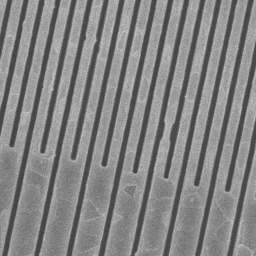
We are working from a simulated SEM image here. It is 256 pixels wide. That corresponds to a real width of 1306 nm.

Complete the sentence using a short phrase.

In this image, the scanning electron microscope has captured parallel lines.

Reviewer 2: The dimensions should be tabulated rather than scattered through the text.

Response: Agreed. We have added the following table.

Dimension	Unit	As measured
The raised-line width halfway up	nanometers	57.5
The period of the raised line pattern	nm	80.3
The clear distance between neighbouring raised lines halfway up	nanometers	26.2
